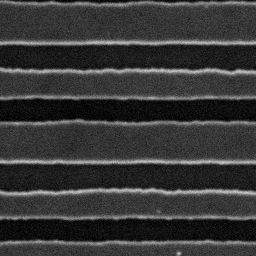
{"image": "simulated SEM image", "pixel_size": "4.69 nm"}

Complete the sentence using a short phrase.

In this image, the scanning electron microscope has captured lines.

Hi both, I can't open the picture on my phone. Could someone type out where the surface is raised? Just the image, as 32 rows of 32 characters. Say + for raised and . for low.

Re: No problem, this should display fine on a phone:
++++++++++++++++++++++++++++++++
++++++++++++++++++++++++++++++++
++++++++++++++++++++++++++++++++
++++++++++++++++++++++++++++++++
++++++++++++++++++++++++++++++++
+..+++.+++.........+............
................................
................................
................................
++++++++++++++++++++++++++++++++
++++++++++++++++++++++++++++++++
++++++++++++++++++++++++++++++++
................................
................................
................................
++++++++++++++++++++++++++++++++
++++++++++++++++++++++++++++++++
++++++++++++++++++++++++++++++++
++++++++++++++++++++++++++++++++
++++++++++++++++++++++++++++++++
................................
................................
................................
................................
++++++++++++++++++++++++++++++++
++++++++++++++++++++++++++++++++
++++++++++++++++++++++++++++++++
................................
................................
................................
++++++++++++++++++++++++++++++++
++++++++++++++++++++++++++++++++